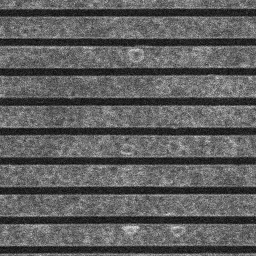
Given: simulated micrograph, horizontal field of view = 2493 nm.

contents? parallel lines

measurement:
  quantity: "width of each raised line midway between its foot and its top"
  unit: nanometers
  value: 206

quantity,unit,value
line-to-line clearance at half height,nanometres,76.7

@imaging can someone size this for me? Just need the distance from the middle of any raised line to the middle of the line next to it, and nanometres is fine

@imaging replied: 289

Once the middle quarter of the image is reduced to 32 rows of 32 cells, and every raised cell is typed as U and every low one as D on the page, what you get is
UUUUUUUUUUUUUUUUUUUUUUUUUUUUUUUU
DDDDDDDDDDDDDDDDDDDDDDDDDDDDDDDD
DDDDDDDDDDDDDDDDDDDDDDDDDDDDDDDD
UUUUUUUUUUUUUUUUUUUUUUUUUUUUUUUU
UUUUUUUUUUUUUUUUUUUUUUUUUUUUUUUU
UUUUUUUUUUUUUUUUUUUUUUUUUUUUUUUU
UUUUUUUUUUUUUUUUUUUUUUUUUUUUUUUU
UUUUUUUUUUUUUUUUUUUUUUUUUUUUUUUU
DDDDDDDDDDDDDDDDDDDDDDDDDDDDDDDD
DDDDDDDDDDDDDDDDDDDDDDDDDDDDDDDD
DDDDDDUUDDDDDDDDDDDDDDDDDDDDDDDD
UUUUUUUUUUUUUUUUUUUUUUUUUUUUUUUU
UUUUUUUUUUUUUUUUUUUUUUUUUUUUUUUU
UUUUUUUUUUUUUUUUUUUUUUUUUUUUUUUU
UUUUUUUUUUUUUUUUUUUUUUUUUUUUUUUU
UUUUUUUUUUUUUUUUUUUUUUUUUUUUUUUU
DDDDDDDDDDDDDDDDDDDDDDDDDDDDDDDD
DDDDDDDDDDDDDDDDDDDDDDDDDDDDDDDD
UUUUUUUUUUUUUUUUUUUUUUUUUUUUUUUU
UUUUUUUUUUUUUUUUUUUUUUUUUUUUUUUU
UUUUUUUUUUUUUUUUUUUUUUUUUUUUUUUU
UUUUUUUUUUUUUUUUUUUUUUUUUUUUUUUU
UUUUUUUUUUUUUUUUUUUUUUUUUUUUUUUU
DDDDDDDDDDDDDDDDDDDDDDDDDDDDDDDD
DDDDDDDDDDDDDDDDDDDDDDDDDDDDDDDD
UUUUUUUUUUUUUUUUUUUUUUUUUUUUUUUU
UUUUUUUUUUUUUUUUUUUUUUUUUUUUUUUU
UUUUUUUUUUUUUUUUUUUUUUUUUUUUUUUU
UUUUUUUUUUUUUUUUUUUUUUUUUUUUUUUU
UUUUUUUUUUUUUUUUUUUUUUUUUUUUUUUU
UDDDDDDDDDDDDDDDDDDDDDDDDUUUUUUU
DDDDDDDDDDDDDDDDDDDDDDDDDDDDDDDD